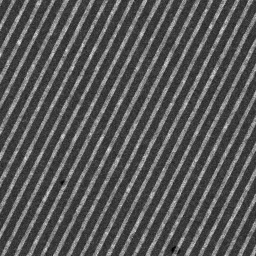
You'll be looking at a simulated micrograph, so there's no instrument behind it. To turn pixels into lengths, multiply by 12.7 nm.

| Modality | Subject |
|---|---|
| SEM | parallel lines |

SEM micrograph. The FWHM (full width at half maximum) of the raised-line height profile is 41.1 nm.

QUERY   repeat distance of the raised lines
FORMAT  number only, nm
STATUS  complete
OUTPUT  149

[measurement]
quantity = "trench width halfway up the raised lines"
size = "105 nm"